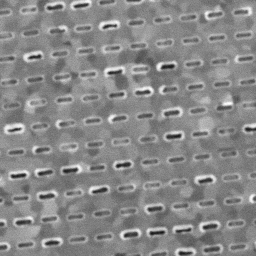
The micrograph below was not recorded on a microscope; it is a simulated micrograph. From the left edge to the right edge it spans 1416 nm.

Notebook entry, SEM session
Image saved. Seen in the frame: a regular array of holes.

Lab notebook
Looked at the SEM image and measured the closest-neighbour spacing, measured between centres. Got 128 nm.